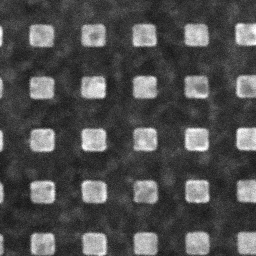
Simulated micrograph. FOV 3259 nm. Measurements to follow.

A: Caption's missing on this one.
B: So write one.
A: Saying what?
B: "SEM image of a regular array of raised bodies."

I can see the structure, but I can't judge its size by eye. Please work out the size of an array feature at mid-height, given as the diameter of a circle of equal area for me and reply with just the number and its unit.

305 nanometres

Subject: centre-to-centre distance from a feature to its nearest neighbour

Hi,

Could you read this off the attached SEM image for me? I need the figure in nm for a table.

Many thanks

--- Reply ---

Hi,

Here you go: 653